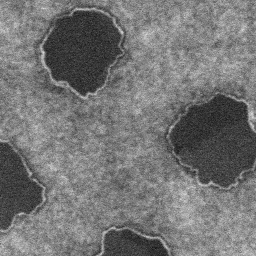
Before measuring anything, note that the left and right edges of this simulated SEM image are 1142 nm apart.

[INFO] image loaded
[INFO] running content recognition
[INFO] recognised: raised bodies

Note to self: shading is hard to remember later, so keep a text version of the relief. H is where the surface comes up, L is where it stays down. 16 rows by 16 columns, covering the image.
LLLLLLLLLLLLLLLL
LLLHHHHLLLLLLLLL
LLLHHHHHLLLLLLLL
LLLHHHHLLLLLLLLL
LLLHHHHLLLLLLLLL
LLLLHHLLLLLLLLLL
LLLLLLLLLLLLHHHL
LLLLLLLLLLLHHHHH
LLLLLLLLLLLHHHHH
HLLLLLLLLLLHHHHH
HHLLLLLLLLLLHHHH
HHLLLLLLLLLLLHHL
HHHLLLLLLLLLLLLL
HLLLLLLLLLLLLLLL
LLLLLLLHHLLLLLLL
LLLLLLHHHHLLLLLL